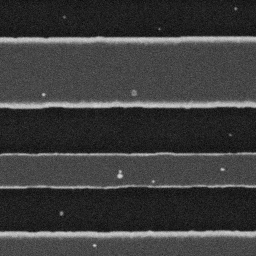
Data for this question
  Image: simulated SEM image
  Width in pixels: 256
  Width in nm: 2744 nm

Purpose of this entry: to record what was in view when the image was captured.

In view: lines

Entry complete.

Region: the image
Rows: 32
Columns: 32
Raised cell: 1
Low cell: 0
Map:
00000000000000000000000000000000
00000000000000000000000000000000
00000000000000000000000000000000
00000000000000000000000000000000
00000000000000000000000000000000
11111111111111111111111111111111
11111111111111111111111111111111
11111111111111111111111111111111
11111111111111111111111111111111
11111111111111111111111111111111
11111111111111111111111111111111
11111111111111111111111111111111
11111111111111111111111111111111
00000000000000000000000000000000
00000000000000000000000000000000
00000000000000000000000000000000
00000000000000000000000000000000
00000000000000000000000000000000
00000000000000000000000000000000
11111111111111111111111111111111
11111111111111111111111111111111
11111111111111111111111111111111
11111111111111111111111111111111
00000000000000000000000000000000
00000000000000000000000000000000
00000000000000000000000000000000
00000000000000000000000000000000
00000000000000000000000000000000
00000000000000000000000000000000
11111111111111111111111111111111
11111111111111111111111111111111
11111111111111111111111111111111